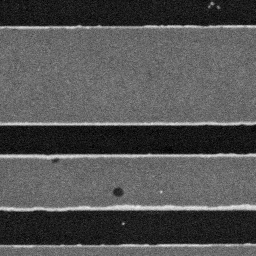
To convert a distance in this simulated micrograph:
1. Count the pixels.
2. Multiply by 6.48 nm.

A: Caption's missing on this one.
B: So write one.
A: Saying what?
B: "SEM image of lines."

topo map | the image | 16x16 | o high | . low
................
................
oooooooooooooooo
oooooooooooooooo
oooooooooooooooo
oooooooooooooooo
oooooooooooooooo
oooooooooooooooo
................
................
oooooooooooooooo
oooooooooooooooo
oooooooooooooooo
................
................
oooooooooooooooo